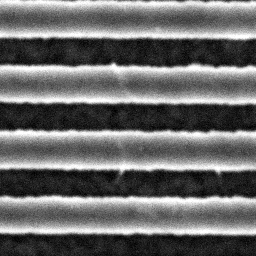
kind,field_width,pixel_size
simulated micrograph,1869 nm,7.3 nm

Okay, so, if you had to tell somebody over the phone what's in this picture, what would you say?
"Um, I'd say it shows lines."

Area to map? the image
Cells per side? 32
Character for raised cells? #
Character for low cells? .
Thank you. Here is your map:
################################
################################
################################
################################
################################
................................
................................
................................
#####################.####.##..#
################################
################################
################################
################################
................................
................................
................................
#.##.....##..#.##...............
################################
################################
################################
################################
................................
................................
................................
................................
################################
################################
################################
################################
................................
................................
................................